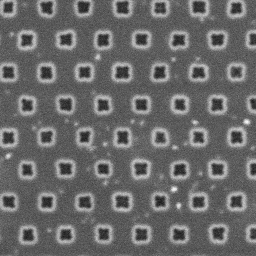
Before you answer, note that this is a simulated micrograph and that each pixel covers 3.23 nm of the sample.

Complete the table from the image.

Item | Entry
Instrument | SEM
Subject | a regular array of holes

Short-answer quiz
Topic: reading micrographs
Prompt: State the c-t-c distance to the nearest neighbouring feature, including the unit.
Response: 119 nm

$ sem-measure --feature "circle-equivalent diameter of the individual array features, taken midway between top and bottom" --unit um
0.0467